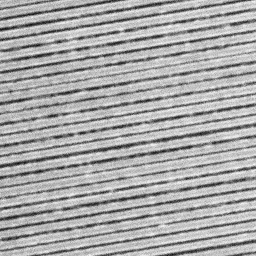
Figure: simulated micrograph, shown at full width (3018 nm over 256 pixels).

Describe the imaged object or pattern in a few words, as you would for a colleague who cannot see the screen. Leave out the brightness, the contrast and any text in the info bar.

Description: parallel lines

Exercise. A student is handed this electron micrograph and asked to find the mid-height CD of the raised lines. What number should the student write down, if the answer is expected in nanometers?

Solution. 74.1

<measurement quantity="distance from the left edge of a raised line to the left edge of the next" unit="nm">123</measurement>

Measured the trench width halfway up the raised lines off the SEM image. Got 52.4 nanometres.